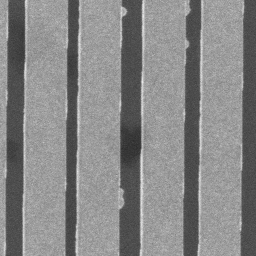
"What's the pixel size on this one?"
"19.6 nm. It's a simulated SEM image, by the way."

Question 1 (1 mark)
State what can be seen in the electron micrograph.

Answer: lines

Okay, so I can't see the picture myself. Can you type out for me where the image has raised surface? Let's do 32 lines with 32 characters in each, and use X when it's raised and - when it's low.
X--XXXXX--XXXXX---XXXXX--XXXXX--
X--XXXXX--XXXXX---XXXXX--XXXXX--
X--XXXXX--XXXXX---XXXXX--XXXXX--
X--XXXXX--XXXXX---XXXXX--XXXXX--
X--XXXXX--XXXXX---XXXXX--XXXXX--
X--XXXXX--XXXXX---XXXXX--XXXXX--
X--XXXXX--XXXXX---XXXXX--XXXXX--
X--XXXXX--XXXXX---XXXXX--XXXXX--
X--XXXXX--XXXXX---XXXXX--XXXXX--
X--XXXXX--XXXXX---XXXXX--XXXXX--
X--XXXXX--XXXXX---XXXXX--XXXXX--
X--XXXXX--XXXXX---XXXXX--XXXXX--
X--XXXXX--XXXXX---XXXXX--XXXXX--
X--XXXXX--XXXXX---XXXXX--XXXXX--
X--XXXXX--XXXXX---XXXXX--XXXXX--
X--XXXXX--XXXXX---XXXXX--XXXXX--
X--XXXXX--XXXXX---XXXXX--XXXXX--
X--XXXXX--XXXXX---XXXXX--XXXXX--
X--XXXXX--XXXXX---XXXXX--XXXXX--
X--XXXXX--XXXXX---XXXXX--XXXXX--
X--XXXXX--XXXXX---XXXXX--XXXXX--
X--XXXXX--XXXXX---XXXXX--XXXXX--
X--XXXXX--XXXXX---XXXXX--XXXXX--
X--XXXXX--XXXXX---XXXXX--XXXXX--
X--XXXXX--XXXXX---XXXXX--XXXXX--
X--XXXXX--XXXXX---XXXXX--XXXXX--
X--XXXXX--XXXXX---XXXXX--XXXXX--
X--XXXXX--XXXXX---XXXXX--XXXXX--
X--XXXXX--XXXXX---XXXXX--XXXXX--
X--XXXXX--XXXXX---XXXXX--XXXXX--
X--XXXXX--XXXXX---XXXXX--XXXXX--
X--XXXXX--XXXXX---XXXXX--XXXXX--